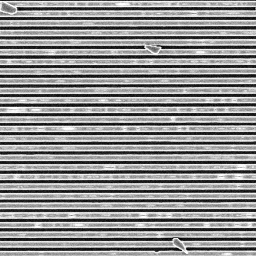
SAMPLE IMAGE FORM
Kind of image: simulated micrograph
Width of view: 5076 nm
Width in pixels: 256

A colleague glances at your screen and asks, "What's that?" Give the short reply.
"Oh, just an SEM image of parallel lines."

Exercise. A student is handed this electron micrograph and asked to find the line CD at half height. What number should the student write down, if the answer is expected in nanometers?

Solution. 119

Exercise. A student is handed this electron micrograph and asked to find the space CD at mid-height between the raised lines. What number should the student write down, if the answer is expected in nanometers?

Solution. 69.4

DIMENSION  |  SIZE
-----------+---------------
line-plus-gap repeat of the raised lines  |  191 nanometers